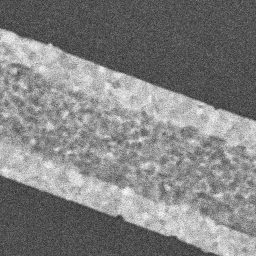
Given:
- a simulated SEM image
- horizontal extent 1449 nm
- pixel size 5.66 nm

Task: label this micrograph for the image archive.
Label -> one or a few lines or trenches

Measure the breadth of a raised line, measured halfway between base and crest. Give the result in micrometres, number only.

0.6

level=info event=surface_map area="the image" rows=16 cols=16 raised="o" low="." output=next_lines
................
................
................
oo..............
oooo............
ooooooo.........
oooooooooo......
ooooooooooooo...
oooooooooooooooo
oooooooooooooooo
..oooooooooooooo
.....ooooooooooo
........oooooooo
..........oooooo
.............ooo
................